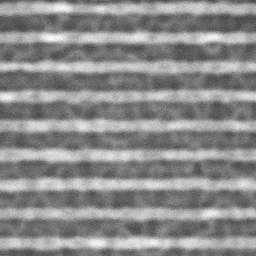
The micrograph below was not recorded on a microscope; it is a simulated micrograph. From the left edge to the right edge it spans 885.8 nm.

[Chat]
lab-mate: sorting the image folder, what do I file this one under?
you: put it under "parallel lines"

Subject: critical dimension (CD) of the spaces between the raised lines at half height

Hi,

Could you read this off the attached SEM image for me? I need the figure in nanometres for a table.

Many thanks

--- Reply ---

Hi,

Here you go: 73.6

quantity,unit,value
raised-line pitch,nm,102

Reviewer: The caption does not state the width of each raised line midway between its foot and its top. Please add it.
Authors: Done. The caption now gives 26.9 nm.